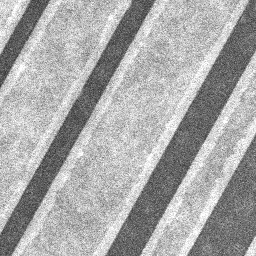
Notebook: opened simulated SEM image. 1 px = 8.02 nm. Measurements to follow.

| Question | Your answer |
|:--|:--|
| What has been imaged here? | one or a few lines or trenches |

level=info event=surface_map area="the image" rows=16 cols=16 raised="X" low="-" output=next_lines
X--XXXXX--XXXXX-
X--XXXX--XXXXX--
--XXXXX--XXXXX--
-XXXXX--XXXXX---
-XXXX--XXXXXX---
XXXXX--XXXXX---X
XXXX--XXXXXX--XX
XXXX--XXXXX---XX
XXX--XXXXX---XXX
XXX--XXXXX---XX-
XX--XXXXX---XX--
X---XXXXX---XX--
X--XXXXX---XX---
--XXXXXX--XXX---
--XXXXX---XX----
-XXXXXX--XXX----